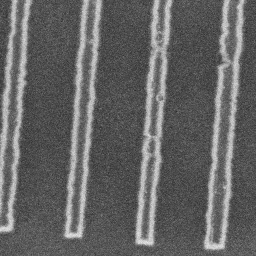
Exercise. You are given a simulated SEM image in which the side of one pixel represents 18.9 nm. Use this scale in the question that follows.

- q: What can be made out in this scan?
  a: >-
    one or a few lines or trenches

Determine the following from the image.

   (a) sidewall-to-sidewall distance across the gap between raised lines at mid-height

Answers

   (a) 1090 nm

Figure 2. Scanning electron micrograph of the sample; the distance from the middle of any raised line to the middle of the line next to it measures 70.8 px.